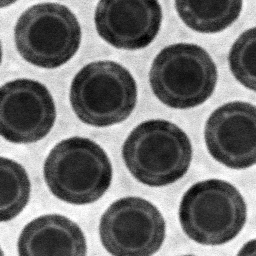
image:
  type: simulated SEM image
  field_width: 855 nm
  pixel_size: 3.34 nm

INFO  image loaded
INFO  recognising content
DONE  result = ring-shaped grooves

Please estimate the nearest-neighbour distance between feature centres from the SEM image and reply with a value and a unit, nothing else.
271 nm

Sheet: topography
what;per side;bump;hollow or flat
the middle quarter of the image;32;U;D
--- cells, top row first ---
UUUUUDDDDDDDDDDUUUUUUUDDDUUUUUUU
UUUUDDDDDDDDDDDDUUUUUDDDUUUUUUUU
UUUDDDDDUUUUDDDDDUUUUDDDUUUUUUUU
UUDDDDUUUUUUUDDDDUUUUDDDUUUUUUUU
UUDDDUUUUUUUUUDDDDUUUDDDDUUUUUUU
UUDDUUUUUUUUUUUDDDUUUUDDDUUUUUUU
UDDDUUUUUUUUUUUDDDUUUUDDDDUUUUUU
UDDDUUUUUUUUUUUDDDUUUUDDDDDUUUUU
UDDDUUUUUUUUUUUDDDUUUUUDDDDDDDUD
UDDDDUUUUUUUUUUDDDUUUUUUDDDDDDDD
UUDDDUUUUUUUUUUDDDUUUUUUUUDDDDDD
UUDDDDUUUUUUUDDDDUUUUUUUUUUUUUUU
UUUDDDDUUUUUDDDDDUUUUUUUUUUUUUUU
UUUUDDDDDDDDDDDDUUUUUUUUUUUUUUUU
UUUUUDDDDDDDDDDUUUUUDDDDDDDUUUUU
UUUUUUUDDDDUUUUUUUDDDDDDDDDDUUUU
UUUUUUUUUUUUUUUUUDDDDDDDDDDDDDUU
UUUUUUUUUUUUUUUUDDDDDUUUUUUDDDDU
UDDDDDUUUUUUUUUDDDDDUUUUUUUUDDDU
DDDDDDDDUUUUUUUDDDDUUUUUUUUUUDDD
DDDDDDDDDUUUUUUDDDUUUUUUUUUUUDDD
DDUUUDDDDDUUUUDDDDUUUUUUUUUUUDDD
UUUUUUUDDDDUUUDDDDUUUUUUUUUUUDDD
UUUUUUUUDDDUUUUDDDUUUUUUUUUUUDDD
UUUUUUUUUDDDUUUDDDUUUUUUUUUUUDDD
UUUUUUUUUDDDUUUDDDDUUUUUUUUUDDDU
UUUUUUUUUDDDUUUUDDDDUUUUUUUDDDDU
UUUUUUUUUDDDUUUUUDDDDDDUDDDDDDUU
UUUUUUUUUDDDUUUUUDDDDDDDDDDDDUUU
UUUUUUUUUDDDUUUUUUUDDDDDDDDDUUUU
UUUUUUUUDDDUUUUUUUUUUDDDDUUUUUUU
DUUUUUUDDDDUUUUUUUUUUUUUUUUUUUUD